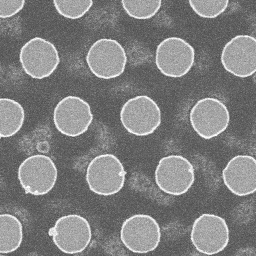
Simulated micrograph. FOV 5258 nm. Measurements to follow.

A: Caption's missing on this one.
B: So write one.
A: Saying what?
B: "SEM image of a regular array of raised bodies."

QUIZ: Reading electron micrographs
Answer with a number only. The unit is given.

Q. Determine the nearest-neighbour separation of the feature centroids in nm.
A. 1380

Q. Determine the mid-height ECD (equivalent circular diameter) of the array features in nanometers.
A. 777